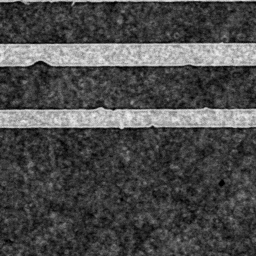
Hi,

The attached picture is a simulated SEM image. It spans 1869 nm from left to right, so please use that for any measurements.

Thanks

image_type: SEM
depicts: one or a few lines or trenches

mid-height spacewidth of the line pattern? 317 nm